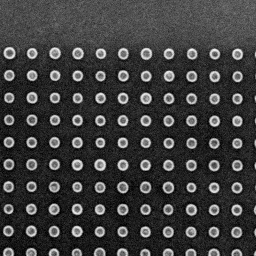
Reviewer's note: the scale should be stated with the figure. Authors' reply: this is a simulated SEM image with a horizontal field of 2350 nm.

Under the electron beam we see a regular array of raised bodies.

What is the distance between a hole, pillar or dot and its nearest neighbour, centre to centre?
0.203 micrometres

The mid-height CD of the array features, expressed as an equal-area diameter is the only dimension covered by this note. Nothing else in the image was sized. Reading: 90.3 nm